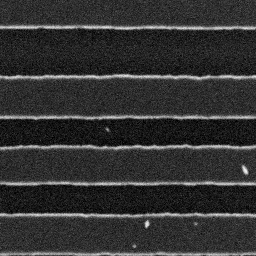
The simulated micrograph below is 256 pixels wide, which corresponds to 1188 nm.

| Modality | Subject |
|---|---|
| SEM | lines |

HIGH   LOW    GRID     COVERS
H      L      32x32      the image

HHHHHHHHHHHHHHHHHHHHHHHHHHHHHHHH
HHHHHHHHHHHHHHHHHHHHHHHHHHHHHHHH
HHHHHHHHHHHHHHHHHHHHHHHHHHHHHHHH
LLLLLLLLLLLLLLHHHHLLLHHHHHHHHLHH
LLLLLLLLLLLLLLLLLLLLLLLLLLLLLLLL
LLLLLLLLLLLLLLLLLLLLLLLLLLLLLLLL
LLLLLLLLLLLLLLLLLLLLLLLLLLLLLLLL
LLLLLLLLLLLLLLLLLLLLLLLLLLLLLLLL
LLLLLLLLLLLLLLLLLLLLLLLLLLLLLLLL
LLLLLLLLLLLLLLHHHLLLLLLLLLLLLLLL
HHHHHHHHHHHHHHHHHHHHHHHHHHHHHHHH
HHHHHHHHHHHHHHHHHHHHHHHHHHHHHHHH
HHHHHHHHHHHHHHHHHHHHHHHHHHHHHHHH
HHHHHHHHHHHHHHHHHHHHHHHHHHHHHHHH
HHHHHHHHHHHHHHHHHHHHHHHHHHHHHHHH
LLLLLLLLLLLLLLLLLLLLLLLLLLLLLLLL
LLLLLLLLLLLLLLLLLLLLLLLLLLLLLLLL
LLLLLLLLLLLLLLLLLLLLLLLLLLLLLLLL
HHHHHHHHHHHHHHHHHHHHHHHHHHHHHHHH
HHHHHHHHHHHHHHHHHHHHHHHHHHHHHHHH
HHHHHHHHHHHHHHHHHHHHHHHHHHHHHHHH
HHHHHHHHHHHHHHHHHHHHHHHHHHHHHHHH
HHHHHHHHHHHHHHHHHHHHHHHHHHHHHHHH
LLLLLLLLLLLLLLLLLLLLLLLLLLLLLLLL
LLLLLLLLLLLLLLLLLLLLLLLLLLLLLLLL
LLLLLLLLLLLLLLLLLLLLLLLLLLLLLLLL
LLLLLLLLLLLLLLLLLLLLLLLLLLLLLLLL
HHHHHHHHHHHHHHHHHHHHHHHHHHHHHHHH
HHHHHHHHHHHHHHHHHHHHHHHHHHHHHHHH
HHHHHHHHHHHHHHHHHHHHHHHHHHHHHHHH
HHHHHHHHHHHHHHHHHHHHHHHHHHHHHHHH
HHHHHHHHHHHHHHHHHHHHHHHHHHHHHHHH